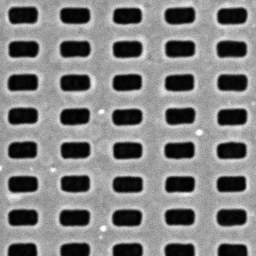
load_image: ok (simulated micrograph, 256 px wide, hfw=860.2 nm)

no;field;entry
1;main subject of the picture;a regular array of holes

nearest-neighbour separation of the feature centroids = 112 nm